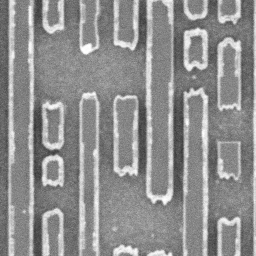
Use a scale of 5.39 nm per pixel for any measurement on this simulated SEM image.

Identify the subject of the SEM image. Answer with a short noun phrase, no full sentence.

parallel lines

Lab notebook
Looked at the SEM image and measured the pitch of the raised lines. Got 0.187 micrometres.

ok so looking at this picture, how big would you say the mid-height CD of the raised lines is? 122 nanometres